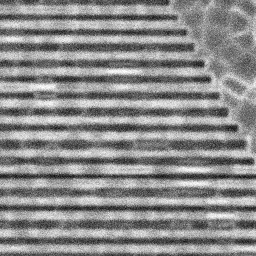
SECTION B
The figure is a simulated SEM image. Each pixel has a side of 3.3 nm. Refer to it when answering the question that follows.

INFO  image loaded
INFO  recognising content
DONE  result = parallel lines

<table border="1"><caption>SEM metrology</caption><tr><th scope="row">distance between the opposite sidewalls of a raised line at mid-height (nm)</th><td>24.7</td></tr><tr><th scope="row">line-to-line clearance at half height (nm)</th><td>28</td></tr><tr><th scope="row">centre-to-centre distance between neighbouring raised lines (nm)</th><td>52.6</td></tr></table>